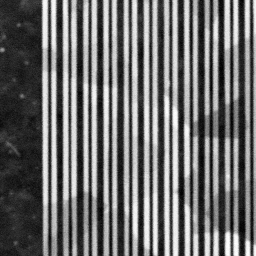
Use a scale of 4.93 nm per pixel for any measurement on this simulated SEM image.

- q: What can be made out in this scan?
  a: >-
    parallel lines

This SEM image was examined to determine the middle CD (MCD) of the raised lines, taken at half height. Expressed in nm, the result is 19.1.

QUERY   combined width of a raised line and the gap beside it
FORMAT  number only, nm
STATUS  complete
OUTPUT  49.8